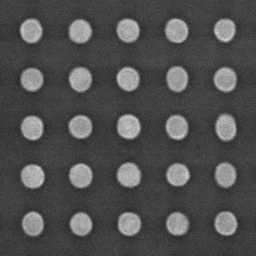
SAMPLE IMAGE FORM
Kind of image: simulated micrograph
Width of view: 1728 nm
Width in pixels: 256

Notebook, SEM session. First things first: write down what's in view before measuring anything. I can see a regular array of raised bodies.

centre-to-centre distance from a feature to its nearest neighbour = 322 nanometers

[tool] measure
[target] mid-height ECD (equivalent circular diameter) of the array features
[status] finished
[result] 155 nanometers